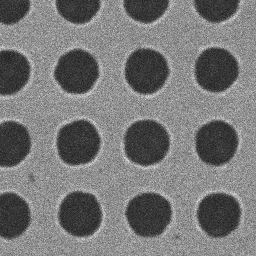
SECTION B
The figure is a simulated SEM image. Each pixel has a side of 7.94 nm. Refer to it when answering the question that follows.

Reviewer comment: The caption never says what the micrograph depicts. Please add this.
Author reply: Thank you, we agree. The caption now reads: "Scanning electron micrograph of a regular array of holes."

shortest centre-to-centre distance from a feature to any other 552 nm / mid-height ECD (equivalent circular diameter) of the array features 357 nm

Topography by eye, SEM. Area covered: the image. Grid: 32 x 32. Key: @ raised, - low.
----@@@------@@------@@@------@@
---@@@@-----@@@@-----@@@@----@@@
---@@@@@---@@@@@@---@@@@@@--@@@@
@@@@@@@@@@@@@@@@@@@@@@@@@@@@@@@@
@@@@@@@@@@@@@@@@@@@@@@@@@@@@@@@@
@@@@@@@@@@@@@@@@@@@@@@@@@@@@@@@@
--@@@@@@@--@@@@@@---@@@@@----@@@
---@@@@-----@@@@-----@@@@-----@@
----@@@-----@@@@-----@@@------@@
----@@@-----@@@@-----@@@------@@
---@@@@-----@@@@-----@@@@----@@@
--@@@@@@---@@@@@@--@@@@@@@--@@@@
@@@@@@@@@@@@@@@@@@@@@@@@@@@@@@@@
@@@@@@@@@@@@@@@@@@@@@@@@@@@@@@@@
@@@@@@@@@@@@@@@@@@@@@@@@@@@@@@@@
--@@@@@@----@@@@----@@@@@@---@@@
----@@@-----@@@@-----@@@@-----@@
----@@@------@@------@@@------@@
----@@@-----@@@@-----@@@------@@
---@@@@-----@@@@-----@@@@----@@@
--@@@@@@--@@@@@@@---@@@@@@--@@@@
@@@@@@@@@@@@@@@@@@@@@@@@@@@@@@@@
@@@@@@@@@@@@@@@@@@@@@@@@@@@@@@@@
@@@@@@@@@@@@@@@@@@@@@@@@@@@@@@@@
--@@@@@@----@@@@@---@@@@@@---@@@
----@@@@----@@@@-----@@@@-----@@
----@@@------@@@-----@@@@-----@@
----@@@------@@@-----@@@@-----@@
---@@@@@----@@@@-----@@@@-----@@
--@@@@@@@--@@@@@@@-@@@@@@@--@@@@
@@@@@@@@@@@@@@@@@@@@@@@@@@@@@@@@
@@@@@@@@@@@@@@@@@@@@@@@@@@@@@@@@